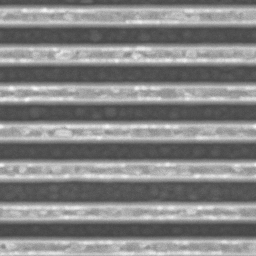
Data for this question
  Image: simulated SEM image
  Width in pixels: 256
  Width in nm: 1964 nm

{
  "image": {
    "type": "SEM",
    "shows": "parallel lines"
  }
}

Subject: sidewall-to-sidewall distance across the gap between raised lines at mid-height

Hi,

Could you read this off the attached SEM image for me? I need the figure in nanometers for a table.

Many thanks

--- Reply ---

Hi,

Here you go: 164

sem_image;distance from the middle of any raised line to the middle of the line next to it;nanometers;302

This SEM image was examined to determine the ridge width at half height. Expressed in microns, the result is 0.13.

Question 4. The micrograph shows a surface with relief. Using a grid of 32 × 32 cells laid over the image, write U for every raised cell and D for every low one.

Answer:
DDDDDDDDDDDDDDDDDDDDDDDDDDDDDDDD
UUUUUUUUUUUUUUUUUUUUUUUUUUUUUUUU
UUUUUUUUUUUUUUUUUUUUUUUUUUUUUUUU
DDDDDDDDDDDDDDDDDDDDDDDDDDDDDDDD
DDDDDDDDDDDDDDDDDDDDDDDDDDDDDDDD
DDDDDDDDDDDDDDDDDDDDDDDDDDDDDDDD
UUUUUUUUUUUUUUUUUUUUUUUUUUUUUUUU
UUUUUUUUUUUUUUUUUUUUUUUUUUUUUUUU
DDDDDDDDDDDDDDDDDDDDDDDDDDDDDDDD
DDDDDDDDDDDDDDDDDDDDDDDDDDDDDDDD
DDDDDDDDDDDDDDDDDDDDDDDDDDDDDDDD
UUUUUUUUUUUUUUUUUUUUUUUUUUUUUUUU
UUUUUUUUUUUUUUUUUUUUUUUUUUUUUUUU
DDDDDDDDDDDDDDDDDDDDDDDDDDDDDDDD
DDDDDDDDDDDDDDDDDDDDDDDDDDDDDDDD
DDDDDDDDDUUUUUUUUUUUUUUUUUUUUUUU
UUUUUUUUUUUUUUUUUUUUUUUUUUUUUUUU
UUUUUUDDDUDDDDDDDDDDDDUDDDDUDDDD
DDDDDDDDDDDDDDDDDDDDDDDDDDDDDDDD
DDDDDDDDDDDDDDDDDDDDDDDDDDDDDDDD
UUUUUUUUUUUUUUUUUUUUUUUUUUUUUUUU
UUUUUUUUUUUUUUUUUUUUUUUUUUUUUUUU
DDDDDDDDDDDDDDDDDDDDDDDDDDDDDDDD
DDDDDDDDDDDDDDDDDDDDDDDDDDDDDDDD
DDDDDDDDDDDDDDDDDDDDDDDDDDDDDDDD
DDDDDDDDDDDDDDDDDDDDDDDDDDDDDDDD
UUUUUUUUUUUUUUUUUUUUUUUUUUUUUUUU
UUUUUUUUUUUUUUUUUUUUUUUUUUUUUUUU
DDDDDDDDDDDDDDDDDDDDDDDDDDDDDDDD
DDDDDDDDDDDDDDDDDDDDDDDDDDDDDDDD
UUUUUUUUUUUUUUUUUUUUUUUUUUUUUUUU
UUUUUUUUUUUUUUUUUUUUUUUUUUUUUUUU